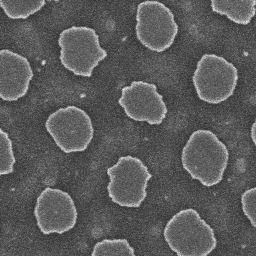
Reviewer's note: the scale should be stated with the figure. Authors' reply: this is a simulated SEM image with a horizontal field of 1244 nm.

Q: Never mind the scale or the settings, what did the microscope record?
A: a regular array of raised bodies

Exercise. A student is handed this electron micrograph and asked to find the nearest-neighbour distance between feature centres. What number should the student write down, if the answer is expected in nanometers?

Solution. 381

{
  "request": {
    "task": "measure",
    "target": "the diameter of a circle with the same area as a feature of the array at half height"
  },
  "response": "220 nanometers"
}